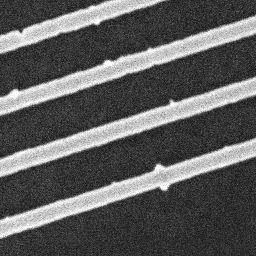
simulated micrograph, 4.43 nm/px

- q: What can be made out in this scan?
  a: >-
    parallel lines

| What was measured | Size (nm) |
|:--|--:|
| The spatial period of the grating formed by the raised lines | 259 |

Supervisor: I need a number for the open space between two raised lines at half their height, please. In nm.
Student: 187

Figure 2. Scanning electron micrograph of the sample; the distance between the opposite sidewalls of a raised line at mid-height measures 70 nanometres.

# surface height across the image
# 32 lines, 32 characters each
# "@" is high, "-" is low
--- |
-------------@@@@@@-------------
----------@@@@@@----------------
-------@@@@@@-----------------@@
----@@@@@@-----------------@@@@@
@@@@@@@-----------------@@@@@@@-
@@@@-----------------@@@@@@@----
@-----------------@@@@@@--------
---------------@@@@@@-----------
------------@@@@@@--------------
---------@@@@@@-----------------
------@@@@@@-----------------@@@
-@@@@@@@@-----------------@@@@@@
@@@@@@-----------------@@@@@@@--
@@@-----------------@@@@@@@-----
-----------------@@@@@@@--------
--------------@@@@@@------------
-----------@@@@@@---------------
--------@@@@@@------------------
----@@@@@@@-----------------@@@@
-@@@@@@@-----------------@@@@@@@
@@@@@-----------------@@@@@@@---
@@-----------------@@@@@@-------
----------------@@@@@@----------
-------------@@@@@@-@-----------
----------@@@@@@----------------
------@@@@@@@-------------------
----@@@@@@----------------------
@@@@@@@-------------------------
@@@@----------------------------
@-------------------------------
--------------------------------
--------------------------------